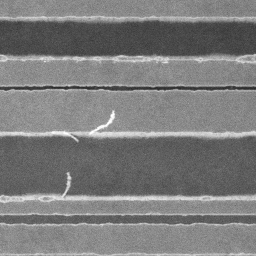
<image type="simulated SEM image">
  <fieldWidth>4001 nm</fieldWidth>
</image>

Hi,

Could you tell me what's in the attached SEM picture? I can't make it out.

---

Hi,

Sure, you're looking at lines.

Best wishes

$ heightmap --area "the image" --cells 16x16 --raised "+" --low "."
++++++++++++++++
................
................
...............+
++++++++++++++++
++++++++++++++++
++++++++++++++++
++++++++++++++++
................
................
................
................
+++++..+++++++++
++++++++++++++++
++++++++++++++++
++++++++++++++++